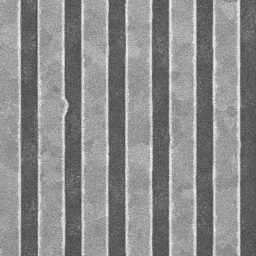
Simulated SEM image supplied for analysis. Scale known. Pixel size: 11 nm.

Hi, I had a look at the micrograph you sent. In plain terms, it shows parallel lines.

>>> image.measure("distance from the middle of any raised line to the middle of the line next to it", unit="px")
43.7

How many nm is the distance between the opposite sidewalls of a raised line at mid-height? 273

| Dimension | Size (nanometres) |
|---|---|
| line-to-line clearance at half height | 207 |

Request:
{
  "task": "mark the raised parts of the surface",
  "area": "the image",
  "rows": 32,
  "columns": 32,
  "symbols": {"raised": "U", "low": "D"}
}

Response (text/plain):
UUDDDUUUDDUUUDDDUUUDDUUUDDDUUUDD
UUDDDUUUDDUUUDDDUUUDDUUUDDDUUUDD
UUDDDUUUDDUUUDDDUUUDDUUUDDDUUUDD
UUDDDUUUDDUUUDDDUUUDDUUUDDDUUUDD
UUDDDUUUDDUUUDDDUUUDDUUUDDDUUUDD
UUDDDUUUDDUUUDDDUUUDDUUUDDDUUUDD
UUDDDUUUDDUUUDDDUUUDDUUUDDDUUUDD
UUDDDUUUDDUUUDDDUUUDDUUUDDDUUUDD
UUDDDUUUDDUUUDDDUUUDDUUUDDDUUUDD
UUDDDUUUDDUUUDDDUUUDDUUUDDDUUUDD
UUDDDUUUDDUUUDDDUUUDDUUUDDDUUUDD
UUDDDUUUDDUUUDDDUUUDDUUUDDDUUUDD
UUDDDUUUDDUUUDDDUUUDDUUUDDDUUUDD
UUDDDUUUDDUUUDDDUUUDDUUUDDDUUUDD
UUDDDUUUDDUUUDDDUUUDDUUUDDDUUUDD
UUDDDUUUDDUUUDDDUUUDDUUUDDDUUUDD
UUDDDUUUDDUUUDDDUUUDDUUUDDDUUUDD
UUDDDUUUDDUUUDDDUUUDDUUUDDDUUUDD
UUDDDUUUDDUUUDDDUUUDDUUUDDDUUUDD
UUDDDUUUDDUUUDDDUUUDDUUUDDDUUUDD
UUDDDUUUDDUUUDDDUUUDDUUUDDDUUUDD
UUDDDUUUDDUUUDDDUUUDDUUUDDDUUUDD
UUDDDUUUDDUUUDDDUUUDDUUUDDDUUUDD
UUDDDUUUDDUUUDDDUUUDDUUUDDDUUUDD
UUDDDUUUDDUUUDDDUUUDDUUUDDDUUUDD
UUDDDUUUDDUUUDDDUUUDDUUUDDDUUUDD
UUDDDUUUDDUUUDDDUUUDDUUUDDDUUUDD
UUDDDUUUDDUUUDDDUUUDDUUUDDDUUUDD
UUDDDUUUDDUUUDDDUUUDDUUUDDDUUUDD
UUDDDUUUDDUUUDDDUUUDDUUUDDDUUUDD
UUDDDUUUDDUUUDDDUUUDDUUUDDDUUUDD
UUDDDUUUDDUUUDDDUUUDDUUUDDDUUUDD